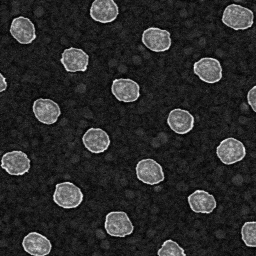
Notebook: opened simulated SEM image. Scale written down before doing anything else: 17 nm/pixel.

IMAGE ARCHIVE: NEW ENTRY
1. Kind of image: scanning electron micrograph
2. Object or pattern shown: a regular array of raised bodies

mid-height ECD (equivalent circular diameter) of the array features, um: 0.438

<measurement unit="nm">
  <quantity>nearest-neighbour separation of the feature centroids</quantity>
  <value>995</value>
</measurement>